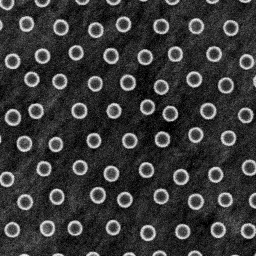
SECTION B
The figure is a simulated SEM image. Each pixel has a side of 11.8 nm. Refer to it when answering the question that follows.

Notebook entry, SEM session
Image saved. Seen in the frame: a regular array of raised bodies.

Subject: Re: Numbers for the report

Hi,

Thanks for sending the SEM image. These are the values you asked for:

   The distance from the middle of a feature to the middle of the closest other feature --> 338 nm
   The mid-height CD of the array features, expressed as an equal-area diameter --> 171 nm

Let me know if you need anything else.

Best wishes